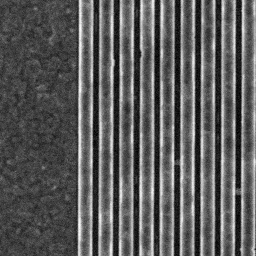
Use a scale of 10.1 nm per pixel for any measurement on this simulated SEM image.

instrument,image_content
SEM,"parallel lines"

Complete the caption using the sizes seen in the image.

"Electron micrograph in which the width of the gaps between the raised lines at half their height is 66.6 nm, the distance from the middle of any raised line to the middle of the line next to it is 205 nm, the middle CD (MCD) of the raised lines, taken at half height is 132 nm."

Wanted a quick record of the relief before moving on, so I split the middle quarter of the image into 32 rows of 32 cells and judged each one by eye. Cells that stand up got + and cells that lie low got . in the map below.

....+++..+++..+++..+++..+++..+++
....+++..+++..+++..+++..+++..+++
....+++..+++..+++..+++..+++..+++
....+++..+++..+++..+++..+++..+++
....+++..+++..+++..+++..+++..+++
....+++..+++..+++..+++..+++..+++
....+++..+++..+++..+++..+++..+++
....+++..+++..+++..+++..+++..+++
....+++..+++..+++..+++..+++..+++
....+++..+++..+++..+++..+++..+++
....+++..+++..+++..+++..+++..+++
....+++..+++..+++..+++..+++..+++
....+++..+++..+++..+++..+++..+++
....+++..+++..+++..+++..+++..+++
....+++..+++..+++..+++..+++..+++
....+++..+++..+++..+++..+++..+++
....+++..+++..+++..+++..+++..+++
....+++..+++..+++..+++..+++..+++
....+++..+++..+++..+++..+++..+++
....+++..+++..+++..+++..+++..+++
....+++..+++..+++..+++..+++..+++
....+++..+++..+++..+++..+++..+++
....+++..+++..+++..+++..+++..+++
....+++..+++..+++..+++..+++..+++
....+++..+++..+++..+++..+++..+++
....+++..+++..+++..+++..+++..+++
....+++..+++..+++..+++..+++..+++
....+++..+++..+++..+++..+++..+++
....+++..+++..+++..+++..+++..+++
....+++..+++..+++..+++..+++..+++
....+++..+++..+++..+++..+++..+++
....+++..+++..+++..+++..+++..+++